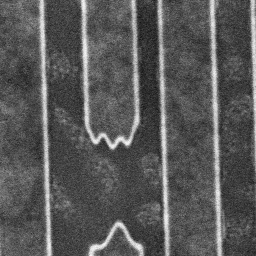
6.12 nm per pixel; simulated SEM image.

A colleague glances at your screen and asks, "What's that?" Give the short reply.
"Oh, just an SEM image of one or a few lines or trenches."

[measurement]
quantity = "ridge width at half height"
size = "321 nm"